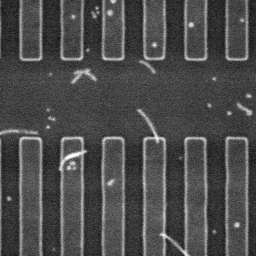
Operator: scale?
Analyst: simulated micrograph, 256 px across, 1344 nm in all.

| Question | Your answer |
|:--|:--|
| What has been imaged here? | groups of lines, slits or small figures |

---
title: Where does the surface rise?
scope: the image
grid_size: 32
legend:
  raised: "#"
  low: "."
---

...##...##...##...###..###..###.
...##...##...##...###..###..###.
...##...##...##...###..###..###.
...##...##...##...###..###..###.
...##...##...##...###..###..###.
...##...##...##...###..###..###.
...##...##...##...###..###..###.
................................
................................
................................
................................
................................
................................
................................
................................
................................
................................
...##...##...##...##...###..###.
...##...##...##...###..###..###.
...##...##...##...###..###..###.
...##...##...##...###..###..###.
...##...##...##...###..###..###.
...##...##...##...###..###..###.
...##...##...##...###..###..###.
...##...##...##...###..###..###.
...##...##...##...###..###..###.
...##...##...##...###..###..###.
...##...##...##...###..###..###.
...##...##...##...###..###..###.
...##...##...##...###..###..###.
...##...##...##...###..###..###.
...##...##...##...###..###..###.